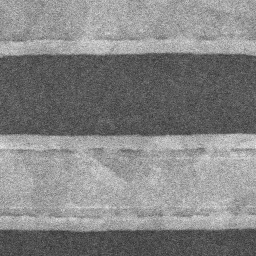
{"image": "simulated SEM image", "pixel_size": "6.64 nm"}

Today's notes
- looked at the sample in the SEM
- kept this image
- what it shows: one or a few lines or trenches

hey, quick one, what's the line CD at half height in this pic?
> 532 nanometers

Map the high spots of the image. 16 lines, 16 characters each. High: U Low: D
UUUUUUUUUUUUUUUU
UUUUUUUUUUUUUUUU
UUUUUUUUUUUUUUUU
DDDDDDDDDDDDDDDD
DDDDDDDDDDDDDDDD
DDDDDDDDDDDDDDDD
DDDDDDDDDDDDDDDD
DDDDDDDDDDDDDDDD
DDDDDDDDDDDDDDDD
UUUUUUUUUUUUUUUU
UUUUUUUUUUUUUUUU
UUUUUUUUUUUUUUUU
UUUUUUUUUUUUUUUU
UUUUUUUUUUUUUUUU
DDDDDDDDDDDDDDDD
DDDDDDDDDDDDDDDD